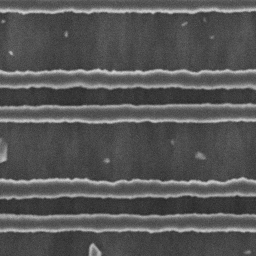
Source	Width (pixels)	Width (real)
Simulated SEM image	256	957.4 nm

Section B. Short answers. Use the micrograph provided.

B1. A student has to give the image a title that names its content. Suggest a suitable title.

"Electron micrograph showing lines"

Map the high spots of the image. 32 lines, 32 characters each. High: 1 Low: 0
11111111111111111111111111111111
00111111011100110111111110000000
00000000000000000000000000000000
00000000000000000000000000000000
00000000000000000000000000000000
00000000000000000000000000000000
00000000000000000000000000000000
00000000000000000000000000000000
00000000000000000000000000000000
11111111111111111111111111111111
11111111111111111111111111111111
00000000000000000000000000000000
00000000000000000000000000000000
11111111111111111111111111111111
11111111111111111111111111111111
00000000000000000000000000000000
00000000000000000000000000000000
00000000000000000000000000000000
00000000000000000000000000000000
00000000000000000000000000000000
00000000000000000000000000000000
00000000000000000000000000000000
11001111111000000100000000000110
11111111111111111111111111111111
11111111111111111111111011111011
00000000000000000000000000000000
00000000000000000000000000000000
11111111111111111111111111111111
11111111111111111111111111111111
00000000000000000000000000000000
00000000000000000000000000000000
00000000000000000000000000000000